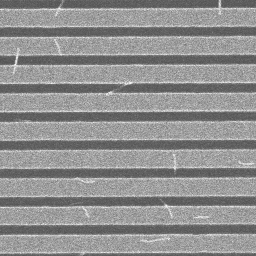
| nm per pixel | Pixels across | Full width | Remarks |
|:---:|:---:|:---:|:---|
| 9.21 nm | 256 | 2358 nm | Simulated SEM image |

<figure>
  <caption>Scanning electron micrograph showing parallel lines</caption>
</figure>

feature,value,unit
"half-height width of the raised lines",0.181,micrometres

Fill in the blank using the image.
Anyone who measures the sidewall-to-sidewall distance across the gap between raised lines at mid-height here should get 78.3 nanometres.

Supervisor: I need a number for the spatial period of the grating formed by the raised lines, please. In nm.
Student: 260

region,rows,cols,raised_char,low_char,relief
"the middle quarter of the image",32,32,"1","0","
11111111111111111111111111111111
11111111111111111111111111111111
11111111111111111111111111111111
11111111111111111111111111111111
11111111111111111111111111111111
00000000000000000000000000000000
00000000000000000000000000000000
11111111111111111111111111111111
11111111111111111111111111111111
11111111111111111111111111111111
11111111111111111111111111111111
11111111111111111111111111111111
00000000000000000000000000000000
00000000000000000000000000000000
11111111111111111111111111111111
11111111111111111111111111111111
11111111111111111111111111111111
11111111111111111111111111111111
11111111111111111111111111111111
00000000000000000000000000000000
00000000000000000000000000000000
11111111111111111111111111111111
11111111111111111111111111111111
11111111111111111111111111111111
11111111111111111111111111111111
11111111111111111111111111111111
00000000000000000000000000010000
00000000000000000000000000000000
00001111111111111111111111111111
11111111111111111111111111111111
11111111111111111111111111111111
11111111111111111111111111111111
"